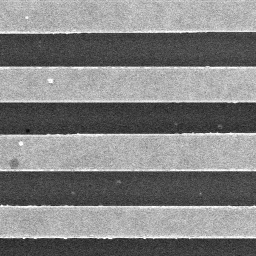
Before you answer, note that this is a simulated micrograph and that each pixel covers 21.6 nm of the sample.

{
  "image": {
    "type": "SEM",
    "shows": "lines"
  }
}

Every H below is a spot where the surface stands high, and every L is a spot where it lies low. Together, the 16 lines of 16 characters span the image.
HHHHHHHHHHHHHHHH
HHHHHHHHHHHHHHHH
LLLLLLLLLLLLLLLL
LLLLLLLLLLLLLLLL
HHHHHHHHHHHHHHHH
HHHHHHHHHHHHHHHH
LLLLLLLLLLLLLLLL
LLLLLLLLLLLLLLLL
HHHHHHHHHHHHHHHH
HHHHHHHHHHHHHHHH
HHHHHHHHHHHHHHHH
LLLLLLLLLLLLLLLL
LLLLLLLLLLLLLLLL
HHHHHHHHHHHHHHHH
HHHHHHHHHHHHHHHH
LLLLLLLLLLLLLLLL